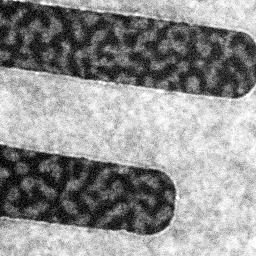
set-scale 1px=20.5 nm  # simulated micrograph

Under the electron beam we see one or a few lines or trenches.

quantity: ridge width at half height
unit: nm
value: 1450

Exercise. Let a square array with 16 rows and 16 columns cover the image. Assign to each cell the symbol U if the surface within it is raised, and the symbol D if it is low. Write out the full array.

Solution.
UUUUUDDDDDDDDDDD
UUUUUUUUUUUUDDDD
UUUUUUUUUUUUUUUU
UUUUUUUUUUUUUUUU
DDUUUUUUUUUUUUUU
DDDDDDDDDUUUUUUU
DDDDDDDDDDDDDDDD
DDDDDDDDDDDDDDDD
DDDDDDDDDDDDDDDD
UUUDDDDDDDDDDDDD
UUUUUUUUUDDDDDDD
UUUUUUUUUUUDDDDD
UUUUUUUUUUUDDDDD
UUUUUUUUUUUDDDDD
DDDDDDDDUUDDDDDD
DDDDDDDDDDDDDDDD